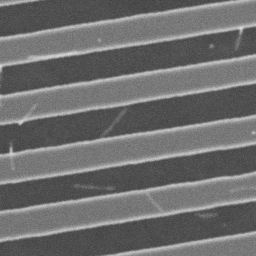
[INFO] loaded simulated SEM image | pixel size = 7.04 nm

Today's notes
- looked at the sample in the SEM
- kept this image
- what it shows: lines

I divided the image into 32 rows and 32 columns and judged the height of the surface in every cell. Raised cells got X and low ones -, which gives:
XX-------------------------XXXXX
--------------------XXXXXXXXXXXX
--------------XXXXXXXXXXXXXXXXXX
-------XXXXXXXXXXXXXXXXXXXXXXXX-
-XXXXXXXXXXXXXXXXXXXXXXX--------
XXXXXXXXXXXXXXXXXXX-------------
XXXXXXXXXXX---------------------
XXXXX-----------------------XXXX
----------------------XXXXXXXXXX
---------------XXXXXXXXXXXXXXXXX
---------XXXXXXXXXXXXXXXXXXXXXXX
--XXXXXXXXXXXXXXXXXXXXXXX-------
XXXXXXXXXXXXXXXXXXX-------------
XXXXXXXXXXXXXX------------------
XXXXXXX------------------------X
X------------------------XXXXXXX
-------------------XXXXXXXXXXXXX
------------XXXXXXXXXXXXXXXXXXXX
-----XXXXXXXXXXXXXXXXXXXXXXXX---
XXXXXXXXXXXXXXXXXXXXXX----------
XXXXXXXXXXXXXXXX----------------
XXXXXXXXXXX---------------------
XXX-----------------------XXXXXX
-------------------XXXXXXXXXXXXX
-------------XXXXXXXXXXXXXXXXXXX
------XXXXXXXXXXXXXXXXXXXXXXX---
XXXXXXXXXXXXXXXXXXXXXXX---------
XXXXXXXXXXXXXXXXX---------------
XXXXXXXXXXX---------------------
XXXXX------------------------XXX
----------------------XXXXXXXXXX
----------------XXXXXXXXXXXXXXXX